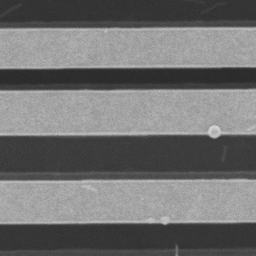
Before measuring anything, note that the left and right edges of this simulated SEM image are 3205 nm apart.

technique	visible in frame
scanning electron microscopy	lines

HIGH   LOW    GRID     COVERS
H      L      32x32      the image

LLLLLLLLLLLLLLLLLLLLLLLLLLLLLLLL
LLLLLLLLLLLLLLLLLLLLLLLLLLLLLLLL
LLLLLLLLLLLLLLLLLLLLLLLLLLLLLLLL
LLLLLLLLLLLLLLHLHHHHHHHHHHHHHHHH
HHHHHHHHHHHHHHHHHHHHHHHHHHHHHHHH
HHHHHHHHHHHHHHHHHHHHHHHHHHHHHHHH
HHHHHHHHHHHHHHHHHHHHHHHHHHHHHHHH
HHHHHHHHHHHHHHHHHHHHHHHHHHHHHHHH
HHHHHHHHLLLLLLLLLLLLLLLLLLLLLLLL
LLLLLLLLLLLLLLLLLLLLLLLLLLLLLLLL
LLLLLLLLLLLLLLLLLLLLLLLLLLLLLLLL
HHHHHHHHHHHHHHHHHHHHHHHHHHHHHHHH
HHHHHHHHHHHHHHHHHHHHHHHHHHHHHHHH
HHHHHHHHHHHHHHHHHHHHHHHHHHHHHHHH
HHHHHHHHHHHHHHHHHHHHHHHHHHHHHHHH
HHHHHHHHHHHHHHHHHHHHHHHHHHHHHHHH
HHHHHHHHHHHHHHHHHHHHHHHHHHHHHHHH
LLLLLLLLLLLLLLLLLLLLLLLLLLLLLLLL
LLLLLLLLLLLLLLLLLLLLLLLLLLLLLLLL
LLLLLLLLLLLLLLLLLLLLLLLLLLLLLLLL
LLLLLLLLLLLLLLLLLLLLLLLLLLLLLLLL
LLLLLLLLLLLLLLLLLLLLLLLLLLLLLLLL
LLLLLLLLLLLLLLLLLLLLLLLLHHHHHHHL
HHHHHHHHHHHHHHHHHHHHHHHHHHHHHHHH
HHHHHHHHHHHHHHHHHHHHHHHHHHHHHHHH
HHHHHHHHHHHHHHHHHHHHHHHHHHHHHHHH
HHHHHHHHHHHHHHHHHHHHHHHHHHHHHHHH
HHHHHHHHHHHHHHHHHHHHHHHHHHHHHHHH
LLLLLLLLLLLLLLLLLLLLLLLLLLLLLLLL
LLLLLLLLLLLLLLLLLLLLLLLLLLLLLLLL
LLLLLLLLLLLLLLLLLLLLLLLLLLLLLLLL
LLLLLLLLLLLLLLLLLLLLLLLLLLLLLLLL